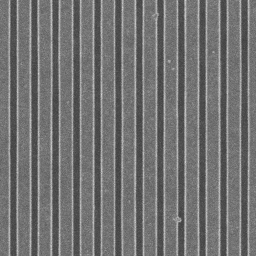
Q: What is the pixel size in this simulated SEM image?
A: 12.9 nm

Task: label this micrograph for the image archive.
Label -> parallel lines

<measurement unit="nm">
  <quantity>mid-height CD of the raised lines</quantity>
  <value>176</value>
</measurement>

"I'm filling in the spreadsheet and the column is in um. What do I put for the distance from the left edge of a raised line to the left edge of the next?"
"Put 0.272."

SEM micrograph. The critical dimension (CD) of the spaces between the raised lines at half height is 100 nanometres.